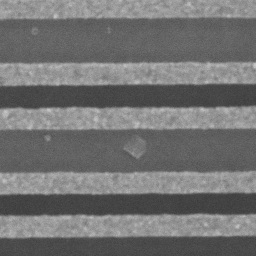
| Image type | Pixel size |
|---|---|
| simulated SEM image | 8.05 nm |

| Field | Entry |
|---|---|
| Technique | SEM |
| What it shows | lines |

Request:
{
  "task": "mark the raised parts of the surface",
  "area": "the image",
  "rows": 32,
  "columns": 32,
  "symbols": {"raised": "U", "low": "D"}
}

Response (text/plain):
UUUUUUUUUUUUUUUUUUUUUUUUUUUUUUUU
UUUUUUUUUUUUUUUUUUUUUUUUUUUUUUUU
DDDDDDDDDDDDDDDDDDDDDDDDDDDDDDDD
DDDDDDDDDDDDDDDDDDDDDDDDDDDDDDDD
DDDDDDDDDDDDDDDDDDDDDDDDDDDDDDDD
DDDDDDDDDDDDDDDDDDDDDDDDDDDDDDDD
DDDDDDDDDDDDDDDDDDDDDDDDDDDDDDDD
DDDDDDDDDDDDDDDDDDDDDDDDDDDDDDDD
UUUUUUUUUUUUUUUUUUUUUUUUUUUUUUUU
UUUUUUUUUUUUUUUUUUUUUUUUUUUUUUUU
UUUUUUUUUUUUUUUUUUUUUUUUUUDDDDDD
DDDDDDDDDDDDDDDDDDDDDDDDDDDDDDDD
DDDDDDDDDDDDDDDDDDDDDDDDDDDDDDDD
DDDDDDDDDUUDDDDUDDDDUDDDUUDUUUUU
UUUUUUUUUUUUUUUUUUUUUUUUUUUUUUUU
UUUUUUUUUUUUUUUUUUUUUUUUUUUUUUUU
DDDDDDDDDDDDDDDDDDDDDDDDDDDDDDDD
DDDDDDDDDDDDDDDDDDDDDDDDDDDDDDDD
DDDDDDDDDDDDDDDDDDDDDDDDDDDDDDDD
DDDDDDDDDDDDDDDDDDDDDDDDDDDDDDDD
DDDDDDDDDDDDDDDDDDDDDDDDDDDDDDDD
DDDDDDDDDDDDDDDDDDDDDDDUDDDDDDDU
UUUUUUUUUUUUUUUUUUUUUUUUUUUUUUUU
UUUUUUUUUUUUUUUUUUUUUUUUUUUUUUUU
DDDDDDDDDDDDDDDDDDDDDDDDDDDDDDDD
DDDDDDDDDDDDDDDDDDDDDDDDDDDDDDDD
DDDDDDDDDDDDDDDDDDDDDDDDDDDDDDDD
UUUUUUUUUUUUUUUUUUUUUUUUUUUUUUUU
UUUUUUUUUUUUUUUUUUUUUUUUUUUUUUUU
UUUUUUUUUUUUUUUUDDDDDDDDDDDDDDDD
DDDDDDDDDDDDDDDDDDDDDDDDDDDDDDDD
DDDDDDDDDDDDDDDDDDDDDDDDDDDDDDDD